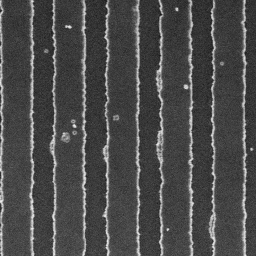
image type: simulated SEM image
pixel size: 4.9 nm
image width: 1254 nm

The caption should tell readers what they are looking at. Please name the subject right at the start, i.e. lines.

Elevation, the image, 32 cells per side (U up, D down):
UUUUDDDUUUUDDUUUUDDDUUUUDDDUUUUD
UUUUDDDUUUUDDUUUUDDDUUUUDDUUUUUD
UUUUDDDUUUUDDUUUUDDDUUUUDDDUUUUD
UUUUDDDUUUUDDUUUUDDDUUUUDDUUUUUD
UUUUDDDUUUUDDUUUUDDDUUUUDDUUUUUD
UUUUDDDUUUUDDUUUUDDDUUUUDDDUUUUD
UUUUDDDUUUUDDUUUUDDDUUUUDDDUUUUD
UUUUDDDUUUUDDUUUUDDDUUUUDDDUUUUD
UUUUDDDUUUUDDUUUUDDDUUUUDDDUUUUD
UUUUDDDUUUUDDUUUUDDDUUUUDDDUUUUD
UUUUDDDUUUUDDUUUUDDDUUUUDDDUUUUD
UUUUDDDUUUUDDUUUUDDDUUUUDDUUUUUD
UUUUDDDUUUUDDUUUUDDDUUUUDDDUUUUD
UUUUDDDUUUUDDUUUUDDDUUUUDDDUUUUD
UUUUDDDUUUUDDUUUUDDDUUUUDDUUUUUD
UUUUDDDUUUUDDUUUUDDDUUUUDDDUUUUD
UUUUDDDUUUUDDUUUUDDDUUUUDDDUUUUD
UUUUDDDUUUUDDUUUUDDDUUUUDDDUUUUD
UUUUDDDUUUUDDUUUUDDDUUUUDDDUUUUD
UUUUDDDUUUUDDUUUUDDDUUUUDDDUUUUD
UUUUDDDUUUUDDUUUUDDDUUUUDDDUUUUD
UUUUDDDUUUUDDUUUUDDDUUUUDDDUUUUD
UUUUDDDUUUUDDUUUUDDDUUUUDDDUUUUD
UUUUDDDUUUUDDUUUUDDDUUUUDDDUUUUD
UUUUDDDUUUUDDUUUUDDDUUUUDDDUUUUD
UUUUDDDUUUUDDUUUUDDDUUUUDDDUUUUD
UUUUDDDUUUUDDUUUUDDDUUUUDDDUUUUD
UUUUDDDUUUUDDUUUUDDDUUUUDDDUUUUD
UUUUDDDUUUUDDUUUUDDDUUUUDDUUUUUD
UUUUDDDUUUUDDUUUUDDDUUUUDDDUUUUD
UUUUDDDUUUUDDUUUUDDDUUUUDDDUUUUD
UUUUDDDUUUUDDUUUUDDDUUUUDDDUUUUD